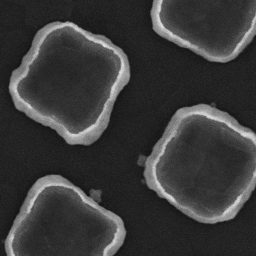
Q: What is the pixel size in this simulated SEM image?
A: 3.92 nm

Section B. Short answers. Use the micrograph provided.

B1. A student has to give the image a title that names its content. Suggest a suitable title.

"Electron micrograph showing raised bodies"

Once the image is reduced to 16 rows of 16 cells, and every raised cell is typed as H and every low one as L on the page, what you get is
LLLLLLLLLLHHHHHH
LLLLHLLLLLHHHHHH
LLHHHHLLLLLHHHHL
LLHHHHHHLLLLLHHL
LHHHHHHHLLLLLLLL
LHHHHHHLLLLLLLLL
LHHHHHHLLLLLLLLL
LLLHHHHLLLLHHHLL
LLLLHHLLLLHHHHHH
LLLLLLLLLLHHHHHH
LLLLLLLLLHHHHHHH
LLHHLLLLLLHHHHHH
LLHHHHLLLLLHHHHL
LHHHHHHLLLLLHHLL
LHHHHHHHLLLLLLLL
HHHHHHHLLLLLLLLL